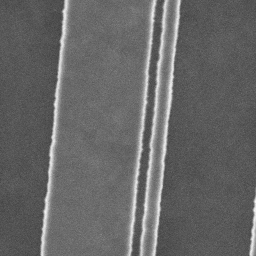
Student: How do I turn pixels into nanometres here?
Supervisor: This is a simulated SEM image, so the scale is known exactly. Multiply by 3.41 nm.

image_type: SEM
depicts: lines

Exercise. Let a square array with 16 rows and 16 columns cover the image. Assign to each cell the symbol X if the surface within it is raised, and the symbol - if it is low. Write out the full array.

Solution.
----XXXXXXX-----
----XXXXXXX-----
----XXXXXXX-----
----XXXXXXX-----
----XXXXXXX-----
----XXXXXXX-----
---XXXXXXXX-----
---XXXXXXX------
---XXXXXXX------
---XXXXXXX------
---XXXXXXX------
---XXXXXXX------
---XXXXXXX------
---XXXXXXX------
---XXXXXXX------
---XXXXXXX------